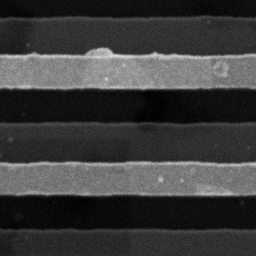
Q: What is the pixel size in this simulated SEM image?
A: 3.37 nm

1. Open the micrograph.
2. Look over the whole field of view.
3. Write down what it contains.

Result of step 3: lines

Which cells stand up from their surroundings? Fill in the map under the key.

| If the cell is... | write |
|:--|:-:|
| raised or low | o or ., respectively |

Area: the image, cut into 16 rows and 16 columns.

................
oooooooooooooooo
oooooooooooooooo
oooooooooooooooo
oooooooooooooooo
oooooooooooooooo
................
................
oooooooooooooooo
oooooooooooooooo
oooooooooooooooo
oooooooooooooooo
................
................
oooooooooooooooo
oooooooooooooooo